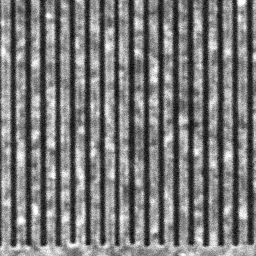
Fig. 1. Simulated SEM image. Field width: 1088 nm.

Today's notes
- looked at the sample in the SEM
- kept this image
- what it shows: parallel lines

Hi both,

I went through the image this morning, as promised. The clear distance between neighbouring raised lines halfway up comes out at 32.4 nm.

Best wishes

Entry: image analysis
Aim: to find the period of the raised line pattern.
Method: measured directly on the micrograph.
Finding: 62.8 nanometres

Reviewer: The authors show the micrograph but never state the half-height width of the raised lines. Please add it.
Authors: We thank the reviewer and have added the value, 32.4 nanometres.